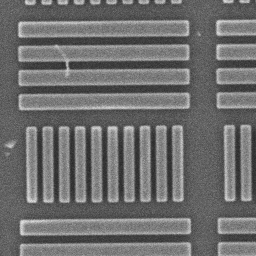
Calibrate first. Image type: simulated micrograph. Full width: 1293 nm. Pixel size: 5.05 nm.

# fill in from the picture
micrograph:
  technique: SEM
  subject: groups of lines, slits or small figures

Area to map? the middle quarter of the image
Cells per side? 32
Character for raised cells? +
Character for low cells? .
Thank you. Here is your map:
................................
+++++++++++++++++++++++++++++++.
+++++++++++++++++++++++++++++++.
+++++++++++++++++++++++++++++++.
+++++++++++++++++++++++++++++++.
................................
................................
.............++++++++++++++++++.
+++++++++++++++++++++++++++++++.
+++++++++++++++++++++++++++++++.
+++++++++++++++++++++++++++++++.
................................
................................
................................
................................
................................
+..++..++..++..++..++..++..+++..
+..++..++..++..++..++..++..+++..
+..++..++..++..++..++..++..+++..
+..++..++..++..++..++..++..+++..
+..++..++..++..++..++..++..+++..
+..++..++..++..++..++..++..+++..
+..++..++..++..++..++..+++.+++..
+..++..++..++..++..++..+++.+++..
+..++..++..++..++..++..+++.+++..
+..++..++..++..++..++..+++.+++..
+..++..++..++..++..++..+++.+++..
+..++..++..+++.++..++..+++.+++..
+..++..++..+++.++..++..+++.+++..
+..++..++..+++.++..++..+++.+++..
+..++..++..+++.++..++..+++.+++..
+..++..++..+++.++..++..+++.+++..